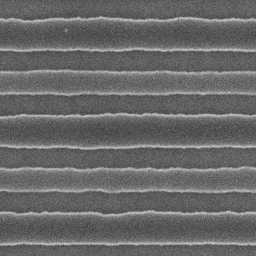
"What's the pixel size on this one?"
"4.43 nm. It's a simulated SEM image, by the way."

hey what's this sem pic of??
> lines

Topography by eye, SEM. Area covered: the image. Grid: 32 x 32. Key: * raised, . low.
................................
................................
***..************.**************
********************************
********************************
********************************
................................
................................
................................
********************************
********************************
********************************
................................
................................
..******************************
********************************
********************************
********************************
..........***.*.................
................................
................................
********************************
********************************
********************************
................................
................................
..................**........*...
********************************
********************************
********************************
**...****....**.***.*..*.....***
................................